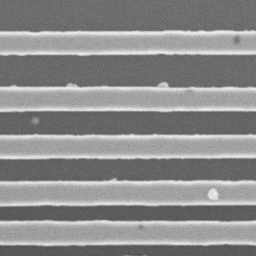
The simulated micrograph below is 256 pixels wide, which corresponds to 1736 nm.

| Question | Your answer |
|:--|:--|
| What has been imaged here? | lines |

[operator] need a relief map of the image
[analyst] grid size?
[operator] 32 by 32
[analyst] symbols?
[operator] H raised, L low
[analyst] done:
LLLLLLLLLLLLLLLLLLLLLLLLLLLLLLLL
LLLLLLLLLLLLLLLLLLLLLLLLLLLLLLLL
LLLLLLLLLLLLLLLLLLLLLLLLLLLLLLLL
LLLLLLLLLLLLLLLLLLLLLLLLLLLLLLLL
HHHHHHHHHHHHHHHHHHHHHHHHHHHHHHHH
HHHHHHHHHHHHHHHHHHHHHHHHHHHHHHHH
HHHHHHHHHHHHHHHHHHHHHHHHHHHHHHHH
LLLLLLLLLLLLLLLLLLLLLLLLLLLLLLLL
LLLLLLLLLLLLLLLLLLLLLLLLLLLLLLLL
LLLLLLLLLLLLLLLLLLLLLLLLLLLLLLLL
LLLLLLLLLLLLLLLLLLLLLLLLLLLLLLLL
HHHHHHHHHHHHHHHHHHHHHHHHHHHHHHHH
HHHHHHHHHHHHHHHHHHHHHHHHHHHHHHHH
HHHHHHHHHHHHHHHHHHHHHHHHHHHHHHHH
LLLLLLLLLLLLLLLLLLLLLLLLLLLLLLLL
LLLLLLLLLLLLLLLLLLLLLLLLLLLLLLLL
LLLLLLLLLLLLLLLLLLLLLLLLLLLLLLLL
HHHHHHHHHHHHHHHHHHHHHHHHHHHHHHHH
HHHHHHHHHHHHHHHHHHHHHHHHHHHHHHHH
HHHHHHHHHHHHHHHHHHHHHHHHHHHHHHHH
LLLLLLLLLLLLLLLLLLLLLLLLLLLLLLLL
LLLLLLLLLLLLLLLLLLLLLLLLLLLLLLLL
LLLLLLLLLLLLLLLLLLLLLLLLLLLLLLLL
HHHHHHHHHHHHHHHHHHHHHHHHHHHHHHHH
HHHHHHHHHHHHHHHHHHHHHHHHHHHHHHHH
HHHHHHHHHHHHHHHHHHHHHHHHHHHHHHHH
LLLLLLLLLLLLLLLLLLLLLLLLLLLLLLLL
LLLLLLLLLLLLLLLLLLLLLLLLLLLLLLLL
HHHHHHHHHHHHHHHHHHHHHHHHHHHHHHHH
HHHHHHHHHHHHHHHHHHHHHHHHHHHHHHHH
HHHHHHHHHHHHHHHHLHHHHHHHHHHHLLHH
LLLLLLLLLLLLLLLLLLLLLLLLLLLLLLLL